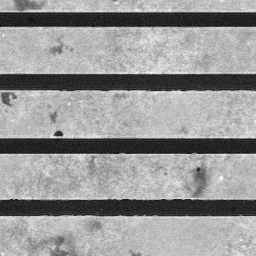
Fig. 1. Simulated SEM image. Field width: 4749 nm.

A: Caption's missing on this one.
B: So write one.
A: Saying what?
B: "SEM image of lines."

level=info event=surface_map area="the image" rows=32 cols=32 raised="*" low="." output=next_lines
********************************
................................
................................
************.**********..*******
********************************
********************************
********************************
********************************
********************************
................................
................................
********************************
********************************
********************************
********************************
********************************
********************************
................................
................................
********************************
********************************
********************************
********************************
********************************
********************************
................................
................................
********************************
********************************
********************************
********************************
********************************